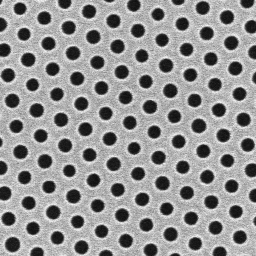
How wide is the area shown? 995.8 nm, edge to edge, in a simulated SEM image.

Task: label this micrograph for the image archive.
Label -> a regular array of holes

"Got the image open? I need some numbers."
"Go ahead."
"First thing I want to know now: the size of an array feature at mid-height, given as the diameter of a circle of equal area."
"13.8 px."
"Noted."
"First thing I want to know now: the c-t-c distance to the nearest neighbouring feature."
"99.8 nm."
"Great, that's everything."